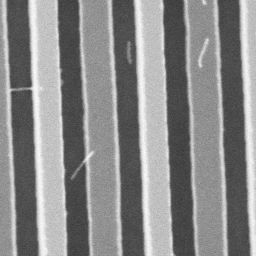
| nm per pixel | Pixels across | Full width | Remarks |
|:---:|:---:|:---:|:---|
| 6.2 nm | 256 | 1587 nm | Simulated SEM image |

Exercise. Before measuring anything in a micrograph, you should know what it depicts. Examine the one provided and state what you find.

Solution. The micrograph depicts lines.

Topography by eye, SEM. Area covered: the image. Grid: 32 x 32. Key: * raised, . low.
*...***...****...***...****...**
*...***...****...***...****...**
*...***...****...***...****...**
*...***...****...***...****...**
*...***...****...***...****...**
*...***...****...***...****...**
*...***...****...***...****...**
*...***...****...****..****...**
*...***...****...****..****...**
*...***...****...****..*****..**
*...***...****...****...****...*
*...****..*****..****...****...*
*...****...****..****...****...*
*...****...****..****...****...*
*...****...****..****...****...*
*...****...****..****...****...*
*...****...****...***...****...*
*...****...****...***...****...*
*....***...****...***...****...*
**...***...****...***...****...*
**...***...****...***...****...*
**...***...****...***...****...*
**...***...****...***...****...*
**...***...****...***...****...*
**...***...****...***...****...*
**...***...****...***...****...*
**...***...****...***...****...*
**...***...****...***...****...*
**...***...****...***...****...*
**...***...****...***...****...*
**...***...****...***...****...*
**...***...****...****..****...*